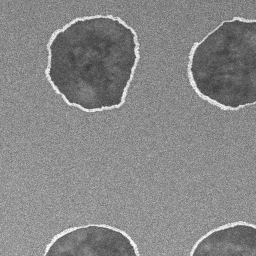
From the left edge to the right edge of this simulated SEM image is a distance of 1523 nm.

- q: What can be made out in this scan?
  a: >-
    holes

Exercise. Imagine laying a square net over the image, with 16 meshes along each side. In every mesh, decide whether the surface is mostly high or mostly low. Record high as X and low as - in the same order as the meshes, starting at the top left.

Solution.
XXXXXXXXXXXXXXXX
XXXX----XXXXXX--
XXX-----XXXXX---
XXX-----XXXX----
XXX-----XXXX----
XXXX----XXXX----
XXXXX--XXXXXXX-X
XXXXXXXXXXXXXXXX
XXXXXXXXXXXXXXXX
XXXXXXXXXXXXXXXX
XXXXXXXXXXXXXXXX
XXXXXXXXXXXXXXXX
XXXXXXXXXXXXXXXX
XXXXXXXXXXXXXXXX
XXXX---XXXXXX---
XXX-----XXXX----